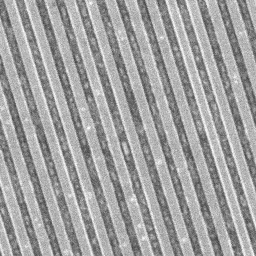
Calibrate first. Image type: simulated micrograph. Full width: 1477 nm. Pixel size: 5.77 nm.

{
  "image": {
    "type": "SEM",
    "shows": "parallel lines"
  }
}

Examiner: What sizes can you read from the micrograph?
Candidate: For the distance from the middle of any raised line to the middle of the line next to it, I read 111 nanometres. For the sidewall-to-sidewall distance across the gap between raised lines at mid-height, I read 57.2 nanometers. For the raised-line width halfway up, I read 0.0572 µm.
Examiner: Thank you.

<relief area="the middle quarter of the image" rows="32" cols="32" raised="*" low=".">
***..***..***..***..***..***...*
.**...**...**...**...**...**...*
.**...**...**...***..***..***..*
.***..***..***..***..***..***...
.***..***...**...**...**...**...
..**...**...***..***..***..**...
..***..***..***..***..***..***..
..***..***...**...**...**...**..
...**...**...**...**...**...**..
...***..***..***..***..***..***.
*..***..***...**..***..***..***.
*...**...**...**...**...**...**.
*...***..***..**...***..***..***
**..***..***..***..***..***..***
**...**...**...**...**...**...**
**...**...**...**...***..***..**
***..***..***..***..***..***..**
.**..***..***...**...**...**...*
.**...**...**...**...***..***..*
.***..***..***..***..***..***..*
.***..***..***.*.**...**...**...
..**...**..***.*.**...**...**...
..**...***..***..***..***..***..
..***..***..***...**..***..***..
...**...**...**...**...**...**..
...***..***..**...**...***..***.
*..***..***..***..***..***..***.
*...**...**...**...**...**...**.
*...**...**...**...**...***..***
**..***..***..***..***..***..***
**...**..***..***...**...**...**
**...**...**...**...***..***..**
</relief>